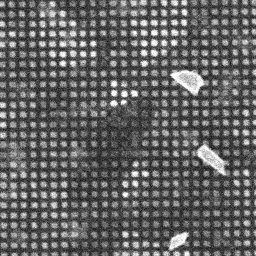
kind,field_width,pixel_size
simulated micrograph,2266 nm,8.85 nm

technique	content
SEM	a regular array of raised bodies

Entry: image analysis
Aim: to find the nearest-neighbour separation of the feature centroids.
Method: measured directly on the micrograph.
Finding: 86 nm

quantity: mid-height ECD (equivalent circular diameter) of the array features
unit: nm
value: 47.9